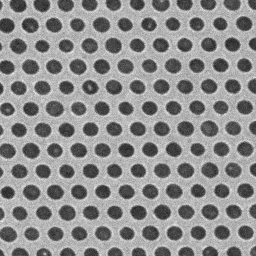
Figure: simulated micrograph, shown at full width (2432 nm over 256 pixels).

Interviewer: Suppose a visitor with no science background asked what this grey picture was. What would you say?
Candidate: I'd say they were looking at a regular array of holes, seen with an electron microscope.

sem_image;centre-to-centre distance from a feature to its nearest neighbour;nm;224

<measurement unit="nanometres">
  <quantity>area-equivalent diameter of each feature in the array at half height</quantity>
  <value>153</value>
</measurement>